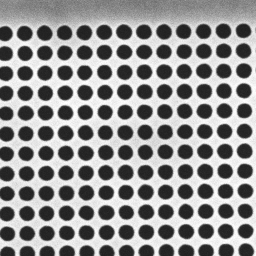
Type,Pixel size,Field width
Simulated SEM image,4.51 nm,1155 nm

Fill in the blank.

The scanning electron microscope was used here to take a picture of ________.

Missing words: a regular array of holes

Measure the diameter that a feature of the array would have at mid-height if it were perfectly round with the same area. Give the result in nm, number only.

70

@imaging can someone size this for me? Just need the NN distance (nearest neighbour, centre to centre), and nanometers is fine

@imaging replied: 88.9